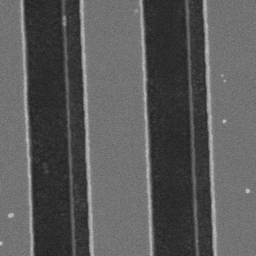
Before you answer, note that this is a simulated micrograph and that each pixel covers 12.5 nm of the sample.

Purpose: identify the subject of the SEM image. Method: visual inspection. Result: lines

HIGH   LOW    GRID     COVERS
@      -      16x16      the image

@----@@@@----@@@
@----@@@@----@@@
@@---@@@@----@@@
@@---@@@@----@@@
@@---@@@@----@@@
@@---@@@@----@@@
@@---@@@@----@@@
@@---@@@@----@@@
@@---@@@@----@@@
@@---@@@@----@@@
@@---@@@@----@@@
@@---@@@@----@@@
@@---@@@@----@@@
@@----@@@----@@@
@@----@@@----@@@
@@----@@@----@@@